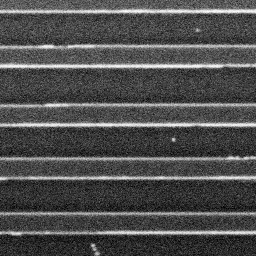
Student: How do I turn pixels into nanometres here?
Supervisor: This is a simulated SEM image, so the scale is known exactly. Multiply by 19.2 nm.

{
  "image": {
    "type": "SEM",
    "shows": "lines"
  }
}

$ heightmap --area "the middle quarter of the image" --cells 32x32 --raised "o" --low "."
oooooooooooooooooooooooooooooooo
................................
................................
................................
................................
................................
................................
................................
................................
................................
oooooooooooooooooooooooooooooooo
oooooooooooooooooooooooooooooooo
oooooooooooooooooooooooooooooooo
oooooooooooooooooooooooooooooooo
oooooooooooooooooooooooooooooooo
................................
................................
................................
................................
................................
................................
................................
................................
................................
oooooooooooooooooooooooooooooooo
oooooooooooooooooooooooooooooooo
oooooooooooooooooooooooooooooooo
oooooooooooooooooooooooooooooooo
oooooooooooooooooooooooooooooooo
................................
................................
................................